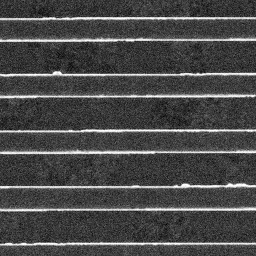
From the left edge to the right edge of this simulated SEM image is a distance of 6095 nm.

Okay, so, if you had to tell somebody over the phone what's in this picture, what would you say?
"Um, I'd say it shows lines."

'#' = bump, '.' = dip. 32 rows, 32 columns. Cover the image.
................................
................................
################################
################################
################################
................................
................................
................................
................................
################################
################################
################################
................................
................................
................................
................................
################################
################################
################################
................................
................................
................................
................................
################################
################################
################################
................................
................................
................................
................................
################################
################################